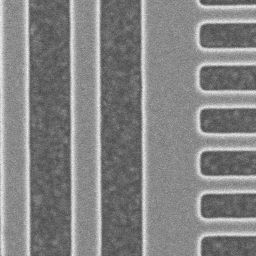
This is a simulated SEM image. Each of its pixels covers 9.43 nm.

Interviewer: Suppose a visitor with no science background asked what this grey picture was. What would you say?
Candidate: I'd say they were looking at groups of lines, slits or small figures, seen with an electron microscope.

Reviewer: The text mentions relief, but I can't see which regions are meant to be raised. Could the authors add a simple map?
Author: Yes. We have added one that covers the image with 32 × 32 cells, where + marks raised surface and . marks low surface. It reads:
+++......+++......+++++++.......
+++......+++......++++++++++++++
+++......+++......++++++++++++++
+++......+++......+++++++.......
+++......+++......+++++++.......
+++......+++......+++++++.......
+++......+++......++++++++++++++
+++......+++......++++++++++++++
+++......+++......+++++++.......
+++......+++......+++++++.......
+++......+++......+++++++.......
+++......+++......++++++++++++++
+++......+++......++++++++++++++
+++......+++......++++++++......
+++......+++......+++++++.......
++++.....+++......+++++++.......
++++.....+++......+++++++.......
+++......+++......++++++++++++++
++++.....+++......++++++++++++++
++++.....+++......+++++++.......
++++.....+++......+++++++.......
++++.....+++......+++++++.......
++++.....+++......++++++++++++++
++++.....+++......++++++++++++++
++++.....+++......+++++++.......
++++.....+++......+++++++.......
++++.....+++......+++++++.......
++++.....++++.....++++++++++++++
++++.....+++......++++++++++++++
++++.....+++......++++++++......
++++.....+++......+++++++.......
++++.....+++......+++++++.......